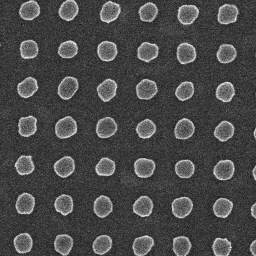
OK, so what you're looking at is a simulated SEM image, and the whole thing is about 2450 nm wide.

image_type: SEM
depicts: a regular array of raised bodies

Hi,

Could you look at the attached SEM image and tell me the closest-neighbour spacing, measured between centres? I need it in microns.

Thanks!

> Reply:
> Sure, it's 0.366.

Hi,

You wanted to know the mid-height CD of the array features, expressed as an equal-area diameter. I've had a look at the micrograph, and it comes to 191 nanometers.